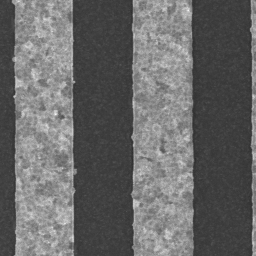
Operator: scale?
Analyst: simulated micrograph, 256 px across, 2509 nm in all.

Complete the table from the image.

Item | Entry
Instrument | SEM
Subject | one or a few lines or trenches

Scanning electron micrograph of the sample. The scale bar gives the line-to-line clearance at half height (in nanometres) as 587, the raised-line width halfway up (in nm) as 568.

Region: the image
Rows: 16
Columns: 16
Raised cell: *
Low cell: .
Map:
.***....****....
.***....****....
.****...****....
.***....****....
.***....****....
.****...****....
.***....****....
.****...****....
.****...****....
.****...****....
.****...****....
.****...****....
.****...****....
.****...****....
.****...****....
.****...****....